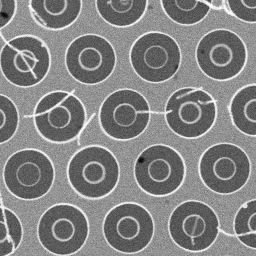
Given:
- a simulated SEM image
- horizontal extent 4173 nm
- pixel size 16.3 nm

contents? an array of small figures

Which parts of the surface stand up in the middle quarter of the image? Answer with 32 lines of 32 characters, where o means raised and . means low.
o...ooooo....oooo....oooo....ooo
o...........oooooo..........oooo
oo..........oooooo..........oooo
oo.........oooooooo.......oooooo
oooo.....ooooooooooooo...ooooooo
oooooooooooooooooooooooooooooooo
oooooooooooooo...oooooooooooo...
.ooooooooooo.......oooooooo.....
...oooooooo.........oooooo......
....oooooo...........ooooo......
.....oooo.....ooo....ooooo....oo
o....oooo....ooooo...oooo....ooo
o....oooo....ooooo...ooooo...ooo
o....oooo....ooooo...ooooo...ooo
o....oooo....oooo....ooooo....oo
.....oooo......o.....ooooo......
....oooooo..........ooooooo.....
....ooooooo........ooooooooo....
...ooooooooo.....oooooooooooooo.
.ooooooooooooooooooooooooooooooo
ooooooo..ooooooooooooo...ooooooo
oooo.......ooooooooo........oooo
ooo.........ooooooo..........ooo
oo...........ooooo............oo
o............ooooo....ooo.....oo
o.....oooo....oooo...ooooo....oo
o....ooooo....ooo....ooooo....oo
o....ooooo....oooo...ooooo....oo
o....ooooo....oooo....oooo....oo
o......o.....ooooo............oo
oo...........oooooo..........ooo
ooo.........oooooooo........oooo